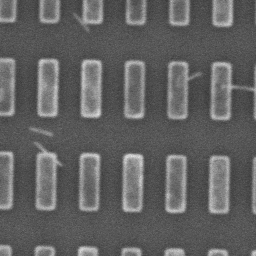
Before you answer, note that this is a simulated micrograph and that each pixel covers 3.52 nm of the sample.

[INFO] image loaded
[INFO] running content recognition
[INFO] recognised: groups of lines, slits or small figures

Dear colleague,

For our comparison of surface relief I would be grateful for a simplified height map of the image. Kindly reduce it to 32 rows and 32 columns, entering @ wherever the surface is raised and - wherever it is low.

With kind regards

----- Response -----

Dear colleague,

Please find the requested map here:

@@---@@----@@---@@---@@----@@---
@@---@@----@@---@@---@@----@@---
@----@@----@----@@---@@----@@---
--------------------------------
--------------------------------
--------------------------------
--------------------------------
--------------------------------
@@---@@---@@----@@---@@----@@---
@@---@@---@@----@@---@@----@@---
@@---@@---@@----@@---@@----@@---
@@---@@---@@----@@---@@----@@---
@@---@@---@@----@@---@@----@@---
@----@@---@@----@@---@@----@@---
----------------@----@@----@----
--------------------------------
--------------------------------
--------------------------------
--------------------------------
@----@@---@@--------------------
@----@@---@@----@@---@@---@@----
@----@@---@@----@@---@@---@@----
@----@@---@@----@@---@@---@@----
@----@@---@@----@@---@@---@@----
@----@@---@@---@@@---@@---@@----
@----@@---@@---@@----@@---@@----
--------------------------------
--------------------------------
--------------------------------
--------------------------------
--------------------------------
@----@@---@@---@@----@@----@----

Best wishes